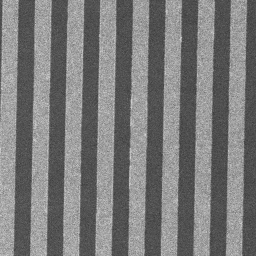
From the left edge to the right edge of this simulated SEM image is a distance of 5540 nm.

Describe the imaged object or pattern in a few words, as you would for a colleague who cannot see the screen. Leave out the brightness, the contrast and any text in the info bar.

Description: parallel lines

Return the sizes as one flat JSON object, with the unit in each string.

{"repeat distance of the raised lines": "32.6 pixels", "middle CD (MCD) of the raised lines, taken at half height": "330 nm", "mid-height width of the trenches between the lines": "373 nanometers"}